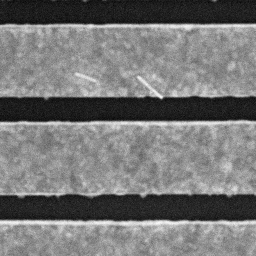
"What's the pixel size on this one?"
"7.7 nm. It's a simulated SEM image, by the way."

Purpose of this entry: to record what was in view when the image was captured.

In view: lines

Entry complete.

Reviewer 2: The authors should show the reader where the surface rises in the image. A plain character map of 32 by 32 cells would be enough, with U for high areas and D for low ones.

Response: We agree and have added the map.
DDDDDDDDDDDDDDDDDDDDDDDDDDDDDDDD
DDDDDDDDDDDDDDDDDDDDDDDDDDDDDDDD
DDDDDDDDDDDDDDDDDDDDDDDDDDDDDDDD
UUUUUUUUUUUUUUUUUUUUUUUUUUUUUUUU
UUUUUUUUUUUUUUUUUUUUUUUUUUUUUUUU
UUUUUUUUUUUUUUUUUUUUUUUUUUUUUUUU
UUUUUUUUUUUUUUUUUUUUUUUUUUUUUUUU
UUUUUUUUUUUUUUUUUUUUUUUUUUUUUUUU
UUUUUUUUUUUUUUUUUUUUUUUUUUUUUUUU
UUUUUUUUUUUUUUUUUUUUUUUUUUUUUUUU
UUUUUUUUUUUUUUUUUUUUUUUUUUUUUUUU
UUUUUUUUUUUUUUUUUUUUUUUUUUUUUUUU
DDDDDDDDDDDDDDDDDDDDDDDDDDDDDDDD
DDDDDDDDDDDDDDDDDDDDDDDDDDDDDDDD
DDDDDDDDDDDDDDDDDDDDDDDDDDDDDDDD
UUUUUUUUUUUUUUUUUUUUUUUUUUUUUUUU
UUUUUUUUUUUUUUUUUUUUUUUUUUUUUUUU
UUUUUUUUUUUUUUUUUUUUUUUUUUUUUUUU
UUUUUUUUUUUUUUUUUUUUUUUUUUUUUUUU
UUUUUUUUUUUUUUUUUUUUUUUUUUUUUUUU
UUUUUUUUUUUUUUUUUUUUUUUUUUUUUUUU
UUUUUUUUUUUUUUUUUUUUUUUUUUUUUUUU
UUUUUUUUUUUUUUUUUUUUUUUUUUUUUUUU
UUUUUUUUUUUUUUUUUUUUUUUUUUUUUUUU
DDDDDDDDDDDDDDDDDDDDDDDDDDDDDDDD
DDDDDDDDDDDDDDDDDDDDDDDDDDDDDDDD
DDDDDDDDDDDDDDDDDDDDDDDDDDDDDDDD
DDDDDDDDDDDDDDDDDDDDDDDDDDDDDDDD
UUUUUUUUUUUUUUUUUUUUUUUUUUUUUUUU
UUUUUUUUUUUUUUUUUUUUUUUUUUUUUUUU
UUUUUUUUUUUUUUUUUUUUUUUUUUUUUUUU
UUUUUUUUUUUUUUUUUUUUUUUUUUUUUUUU